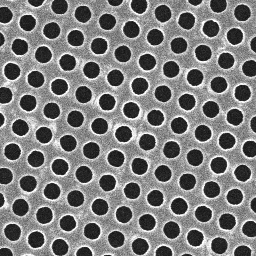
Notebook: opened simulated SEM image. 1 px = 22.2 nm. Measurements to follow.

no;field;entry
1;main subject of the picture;a regular array of holes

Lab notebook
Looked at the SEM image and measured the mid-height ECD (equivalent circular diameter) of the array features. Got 380 nanometers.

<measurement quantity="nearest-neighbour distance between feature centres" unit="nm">552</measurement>